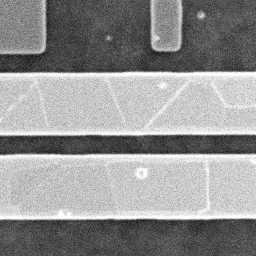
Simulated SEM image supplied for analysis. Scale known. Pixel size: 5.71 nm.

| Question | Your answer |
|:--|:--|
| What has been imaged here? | wiring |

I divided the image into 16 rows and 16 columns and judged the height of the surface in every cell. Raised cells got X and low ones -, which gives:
XXX------XX-----
XXX-------X-----
XXX-------X-----
----------------
----------------
XXXXXXXXXXXXXXXX
XXXXXXXXXXXXXXXX
XXXXXXXXXXXXXXXX
----------------
----------------
XXXXXXXXXXXXXXXX
XXXXXXXXXXXXXXXX
XXXXXXXXXXXXXXXX
XXXXXXXXXXXXXXXX
----------------
----------------